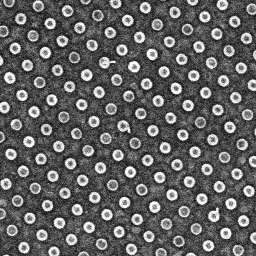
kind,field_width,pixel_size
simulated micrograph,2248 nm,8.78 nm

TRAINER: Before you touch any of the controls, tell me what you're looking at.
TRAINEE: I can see a regular array of raised bodies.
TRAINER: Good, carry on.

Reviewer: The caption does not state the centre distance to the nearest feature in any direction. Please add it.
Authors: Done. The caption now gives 183 nm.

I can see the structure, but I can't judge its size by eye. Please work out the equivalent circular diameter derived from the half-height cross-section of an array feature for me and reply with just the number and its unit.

90.2 nm